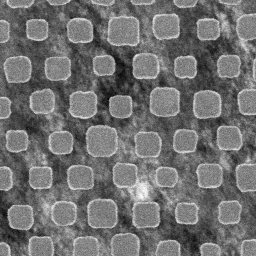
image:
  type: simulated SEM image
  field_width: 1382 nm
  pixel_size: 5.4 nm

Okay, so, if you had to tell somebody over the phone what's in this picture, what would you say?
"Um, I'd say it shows a regular array of raised bodies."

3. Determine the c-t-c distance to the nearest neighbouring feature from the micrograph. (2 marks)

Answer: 0.215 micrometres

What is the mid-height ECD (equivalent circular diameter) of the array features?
141 nm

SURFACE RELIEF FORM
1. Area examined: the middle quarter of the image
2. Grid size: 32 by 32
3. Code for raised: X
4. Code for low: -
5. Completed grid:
X------XXXXXX----XXXXXXX----XXXX
X-------XXXXX----XXXXXXX----XXXX
X-------XXXX-----XXXXXX-----XXXX
X-------------------------------
--------------------------------
--------------------------------
----------------------XXXXXX----
--XXXXXX--------------XXXXXXX---
--XXXXXX----XXXXX-----XXXXXXX---
--XXXXXX---XXXXXX-----XXXXXXX---
--XXXXXX---XXXXXX-----XXXXXXX---
-XXXXXXX---XXXXXX-----XXXXXXX---
--XXXXXX----XXXXX------XXXXX----
--------------X-----------------
--------------------------------
--------XX----------------------
------XXXXXXX----------------XX-
XX----XXXXXXX-----XXXXX-----XXXX
XX----XXXXXXX-----XXXXXX---XXXXX
XX----XXXXXXX-----XXXXXX---XXXXX
XX----XXXXXXX-----XXXXXX---XXXXX
XX----XXXXXXX-----XXXXXX----XXXX
-------XXXXX------XXXXXX--------
--------------------------------
--------------------------------
---XX--------XXXXX--------------
-XXXXXX-----XXXXXX-----XXXXX----
-XXXXXX-----XXXXXX-----XXXXX----
-XXXXXX-----XXXXXX-----XXXXX----
-XXXXXX-----XXXXXX-----XXXXX----
--XXXXX------XXXXX------XXX-----
--------------------------------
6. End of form